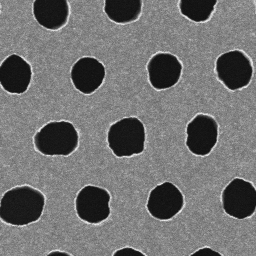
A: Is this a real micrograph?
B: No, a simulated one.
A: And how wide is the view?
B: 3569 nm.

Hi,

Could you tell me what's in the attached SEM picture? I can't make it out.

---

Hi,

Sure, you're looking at a regular array of holes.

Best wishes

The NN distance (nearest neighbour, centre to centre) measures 983 nanometres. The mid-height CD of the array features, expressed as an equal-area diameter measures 0.497 micrometres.